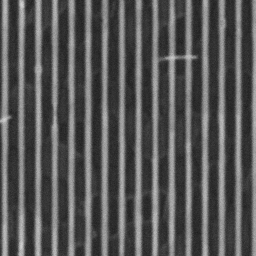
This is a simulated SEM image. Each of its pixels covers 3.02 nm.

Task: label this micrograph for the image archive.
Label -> parallel lines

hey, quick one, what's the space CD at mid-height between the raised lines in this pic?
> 38.5 nm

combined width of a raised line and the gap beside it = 50.4 nm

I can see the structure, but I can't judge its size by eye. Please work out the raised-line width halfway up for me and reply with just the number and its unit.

10.9 nm